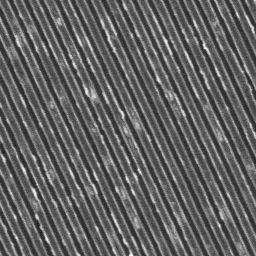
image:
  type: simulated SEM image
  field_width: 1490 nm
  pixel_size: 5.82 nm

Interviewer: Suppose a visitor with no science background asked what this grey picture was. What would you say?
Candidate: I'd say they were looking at parallel lines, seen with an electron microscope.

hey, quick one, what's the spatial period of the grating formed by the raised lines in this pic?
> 81.7 nm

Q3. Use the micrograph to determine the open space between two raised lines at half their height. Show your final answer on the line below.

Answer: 28.4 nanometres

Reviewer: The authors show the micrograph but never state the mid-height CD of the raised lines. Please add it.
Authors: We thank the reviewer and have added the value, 51.6 nm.